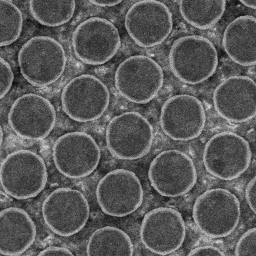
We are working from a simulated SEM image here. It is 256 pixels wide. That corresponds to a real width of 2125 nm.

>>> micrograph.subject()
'a regular array of raised bodies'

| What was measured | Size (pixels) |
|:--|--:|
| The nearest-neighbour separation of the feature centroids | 56.6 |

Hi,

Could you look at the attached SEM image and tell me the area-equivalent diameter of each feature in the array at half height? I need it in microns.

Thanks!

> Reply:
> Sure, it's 0.376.